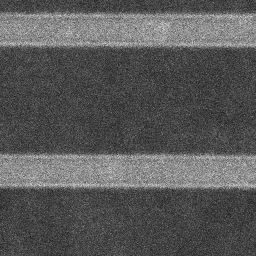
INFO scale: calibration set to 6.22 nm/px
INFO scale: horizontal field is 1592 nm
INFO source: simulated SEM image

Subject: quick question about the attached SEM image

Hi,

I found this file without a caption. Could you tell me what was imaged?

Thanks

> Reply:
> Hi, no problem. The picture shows one or a few lines or trenches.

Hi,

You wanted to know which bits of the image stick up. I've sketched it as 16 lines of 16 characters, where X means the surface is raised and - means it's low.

XXXXXXXXXXXXXXXX
----------------
----------------
XXXXXXXXXXXXXXXX
XXXXXXXXXXXXXXXX
XXXXXXXXXXXXXXXX
XXXXXXXXXXXXXXXX
XXXXXXXXXXXXXXXX
XXXXXXXXXXXXXXXX
XXXXXXXXXXXXXXXX
----------------
-X--------------
XXXXXXXXXXXXXXXX
XXXXXXXXXXXXXXXX
XXXXXXXXXXXXXXXX
XXXXXXXXXXXXXXXX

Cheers